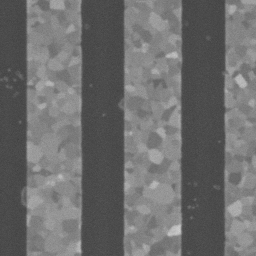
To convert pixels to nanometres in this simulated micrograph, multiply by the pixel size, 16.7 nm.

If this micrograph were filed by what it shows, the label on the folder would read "lines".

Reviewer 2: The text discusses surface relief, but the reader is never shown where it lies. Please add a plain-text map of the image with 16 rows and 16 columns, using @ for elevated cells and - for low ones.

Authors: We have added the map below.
--@@@---@@@---@@
--@@@---@@@---@@
--@@@---@@@---@@
--@@@---@@@---@@
--@@@---@@@---@@
--@@@---@@@---@@
--@@@---@@@---@@
--@@@---@@@---@@
--@@@---@@@---@@
--@@@---@@@---@@
--@@@---@@@---@@
--@@@---@@@---@@
--@@@---@@@---@@
--@@@---@@@---@@
--@@@---@@@---@@
--@@@---@@@---@@